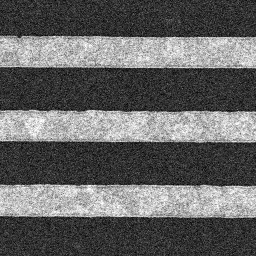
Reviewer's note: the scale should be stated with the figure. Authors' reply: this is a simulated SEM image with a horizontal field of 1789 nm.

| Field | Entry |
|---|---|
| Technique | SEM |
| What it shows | one or a few lines or trenches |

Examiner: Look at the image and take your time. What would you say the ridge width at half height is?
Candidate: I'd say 209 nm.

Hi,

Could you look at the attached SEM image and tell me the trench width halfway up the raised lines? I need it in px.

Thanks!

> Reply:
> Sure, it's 44.4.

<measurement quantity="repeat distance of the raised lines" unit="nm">521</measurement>